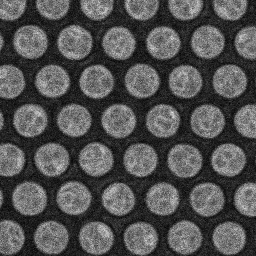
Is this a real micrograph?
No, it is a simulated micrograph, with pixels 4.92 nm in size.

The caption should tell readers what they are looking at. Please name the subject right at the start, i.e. a regular array of raised bodies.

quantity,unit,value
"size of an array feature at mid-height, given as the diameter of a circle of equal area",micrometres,0.164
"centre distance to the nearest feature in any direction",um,0.217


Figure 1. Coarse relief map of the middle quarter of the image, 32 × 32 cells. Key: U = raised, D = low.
DDDDDDDUUUDDDDDDDDUUUDDDDDDDDDDD
DDDDDUUUUUUDDDDDUUUUUUUDDDDUUUUU
UDDDDUUUUUUUDDDDUUUUUUUDDDDUUUUU
UDDDUUUUUUUUDDDUUUUUUUUUDDUUUUUU
UDDDUUUUUUUUDDDUUUUUUUUUDDUUUUUU
UDDDUUUUUUUUDDDUUUUUUUUUDDUUUUUU
UDDDUUUUUUUUDDDDUUUUUUUDDDDUUUUU
DDDDDUUUUUUDDDDDDUUUUUDDDDDDUUUU
DDDDDDDUUDDDDDDDDDDDDDDDDDDDDDDD
DDDDDDDDDDDDDDDDDDDDDDDDDDDDDDDD
DUUUDDDDDDDDUUUDDDDDDDDUUUDDDDDD
UUUUUUDDDDDUUUUUUDDDDDUUUUUUDDDD
UUUUUUDDDDUUUUUUUDDDDUUUUUUUDDDD
UUUUUUUDDDUUUUUUUUDDDUUUUUUUUDDD
UUUUUUUDDDUUUUUUUUDDDUUUUUUUUDDD
UUUUUUDDDDUUUUUUUUDDDUUUUUUUUDDD
UUUUUUDDDDUUUUUUUDDDDUUUUUUUDDDD
DUUUDDDDDDDUUUUUDDDDDDUUUUUDDDDD
DDDDDDDDDDDDDDDDDDDDDDDDDDDDDDDD
DDDDDDDDDDDDDDDDDDDDDDDDDDDDDDDD
DDDDDDUUUUDDDDDDDUUUUDDDDDDDUUUU
DDDDDUUUUUUDDDDDUUUUUUDDDDDUUUUU
UDDDUUUUUUUUDDDUUUUUUUUDDDUUUUUU
UDDDUUUUUUUUDDDUUUUUUUUDDDUUUUUU
UDDDUUUUUUUUDDDUUUUUUUUDDDUUUUUU
UDDDUUUUUUUUDDDUUUUUUUUDDDUUUUUU
DDDDDUUUUUUDDDDDUUUUUUUDDDDUUUUU
DDDDDDUUUUDDDDDDDUUUUDDDDDDDUUUU
DDDDDDDDDDDDDDDDDDDDDDDDDDDDDDDD
DDDDDDDDDDDDDDDDDDDDDDDDDDDDDDDD
UUUUUDDDDDDUUUUUDDDDDDDUUUUDDDDD
UUUUUUDDDDUUUUUUUDDDDUUUUUUUDDDD